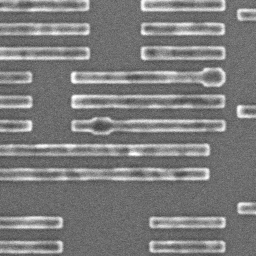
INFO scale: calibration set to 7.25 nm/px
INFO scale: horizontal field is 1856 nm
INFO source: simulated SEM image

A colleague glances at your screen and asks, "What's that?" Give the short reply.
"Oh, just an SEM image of wiring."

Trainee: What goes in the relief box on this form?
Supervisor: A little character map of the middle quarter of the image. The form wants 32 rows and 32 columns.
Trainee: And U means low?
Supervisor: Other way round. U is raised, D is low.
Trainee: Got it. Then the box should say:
DDDDDDDDDDDDDDDDDDDDDDDDDDDDDDDD
DDDDDDDDDDDDDDDDDDDDDDDDDDDDDDDD
DDUUUUUUUUUUUUUUUUUUUUUUUUUUUUUU
DDUUUUUUUUUUUUUUUUUUUUUUUUUUUUUU
DDUUUUUUUUUUUUUUUUUUUUUUUUUUUUUU
DDDDDDDDDDDDDDDDDDDDDDDDDDDDDDDD
DDDDDDDDDDDDDDDDDDDDDDDDDDDDDDDD
DDDDDDDDDDDDDDDDDDDDDDDDDDDDDDDD
DDUUUUUUUUUUUUUUUUUUUUUUUUUUUUUU
DDUUUUUUUUUUUUUUUUUUUUUUUUUUUUUU
DDUUUUUUUUUUUUUUUUUUUUUUUUUUUUUU
DDDDDDDDDDDDDDDDDDDDDDDDDDDDDDDD
DDDDDDDDDDDDDDDDDDDDDDDDDDDDDDDD
DDDDDDDDUUUDDDDDDDDDDDDDDDDDDDDD
DDUUUUUUUUUUUUUUUUUUUUUUUUUUUUUU
DDUUUUUUUUUUUUUUUUUUUUUUUUUUUUUU
DDUUUUUUUUUUUUUUUUUUUUUUUUUUUUUU
DDDDDDDDDDDDDDDDDDDDDDDDDDDDDDDD
DDDDDDDDDDDDDDDDDDDDDDDDDDDDDDDD
DDDDDDDDDDDDDDDDDDDDDDDDDDDDDDDD
UUUUUUUUUUUUUUUUUUUUUUUUUUUUUUUU
UUUUUUUUUUUUUUUUUUUUUUUUUUUUUUUU
UUUUUUUUUUUUUUUUUUUUUUUUUUUUUUUU
DDDDDDDDDDDDDDDDDDDDDDDDDDDDDDDD
DDDDDDDDDDDDDDDDDDDDDDDDDDDDDDDD
DDDDDDDDDDDDDDDDDDDDDDDDDDDDDDDD
UUUUUUUDDDUUUUUUUUUUUUUUUUUUUUUU
UUUUUUUUUUUUUUUUUUUUUUUUUUUUUUUU
UUUUUUUUUUUUUUUUUUUUUUUUUUUUUUUU
DDDDDDDDDDDDDDDDDDDDDDDDDDDDDDDD
DDDDDDDDDDDDDDDDDDDDDDDDDDDDDDDD
DDDDDDDDDDDDDDDDDDDDDDDDDDDDDDDD